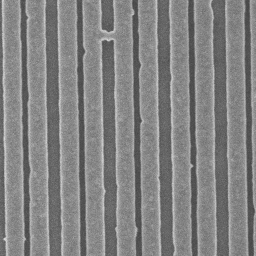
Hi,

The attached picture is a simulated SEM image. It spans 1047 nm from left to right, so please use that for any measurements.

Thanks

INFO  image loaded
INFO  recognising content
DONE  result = parallel lines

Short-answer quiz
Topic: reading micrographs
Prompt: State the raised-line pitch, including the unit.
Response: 114 nanometers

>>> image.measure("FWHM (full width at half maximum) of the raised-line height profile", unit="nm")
76.2